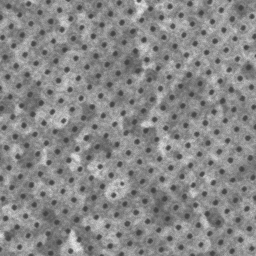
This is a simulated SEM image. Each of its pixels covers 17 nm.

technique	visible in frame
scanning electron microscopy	a regular array of holes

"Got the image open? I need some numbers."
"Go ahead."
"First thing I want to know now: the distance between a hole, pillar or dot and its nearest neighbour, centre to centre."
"237 nm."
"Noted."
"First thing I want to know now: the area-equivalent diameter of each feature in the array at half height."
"110 nm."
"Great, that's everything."